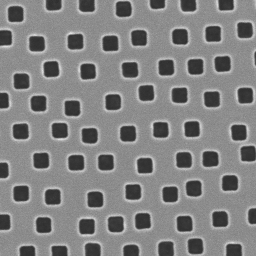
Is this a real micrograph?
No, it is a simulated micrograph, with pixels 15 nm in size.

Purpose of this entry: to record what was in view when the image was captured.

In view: a regular array of holes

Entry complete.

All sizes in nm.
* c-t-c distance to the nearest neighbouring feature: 444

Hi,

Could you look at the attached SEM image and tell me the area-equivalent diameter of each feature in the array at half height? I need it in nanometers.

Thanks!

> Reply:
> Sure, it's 265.